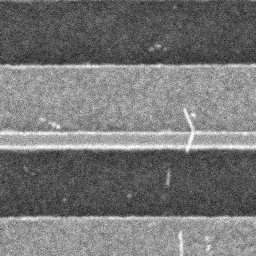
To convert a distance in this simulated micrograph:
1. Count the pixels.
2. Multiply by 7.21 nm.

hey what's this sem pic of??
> lines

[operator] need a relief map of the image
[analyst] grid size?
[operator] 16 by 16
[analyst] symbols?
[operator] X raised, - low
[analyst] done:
----------------
----------------
----------------
----------------
XXXXXXXXXXXXXXXX
XXXXXXXXXXXXXXXX
XXXXXXXXXXXXXXXX
XXXXXXXXXXXXXXXX
XXXXXXXXXXXXXXXX
----------------
----------------
----------------
----------------
----------------
XXXXXXXXXXXXXXXX
XXXXXXXXXXXXXXXX